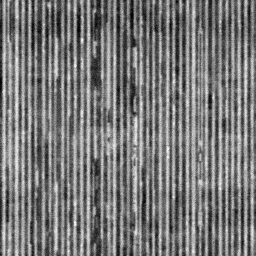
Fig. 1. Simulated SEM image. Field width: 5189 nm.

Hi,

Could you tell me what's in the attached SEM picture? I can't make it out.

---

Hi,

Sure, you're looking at parallel lines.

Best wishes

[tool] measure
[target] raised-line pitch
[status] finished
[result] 133 nm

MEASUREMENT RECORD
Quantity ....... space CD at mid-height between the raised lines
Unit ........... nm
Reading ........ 78.5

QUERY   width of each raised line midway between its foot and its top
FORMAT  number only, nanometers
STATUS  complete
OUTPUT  40.5